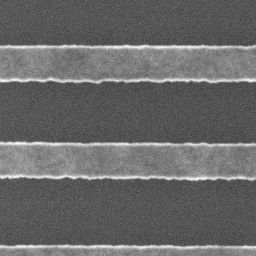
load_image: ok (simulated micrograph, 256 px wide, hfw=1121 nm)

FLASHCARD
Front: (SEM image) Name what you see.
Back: lines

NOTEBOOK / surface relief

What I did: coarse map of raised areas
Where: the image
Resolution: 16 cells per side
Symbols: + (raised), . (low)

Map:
................
................
................
++++++++++++++++
++++++++++++++++
................
................
................
................
++++++++++++++++
++++++++++++++++
................
................
................
................
++++++++++++++++